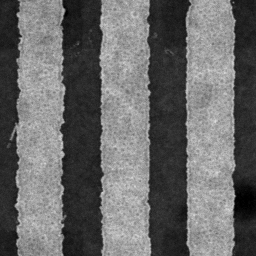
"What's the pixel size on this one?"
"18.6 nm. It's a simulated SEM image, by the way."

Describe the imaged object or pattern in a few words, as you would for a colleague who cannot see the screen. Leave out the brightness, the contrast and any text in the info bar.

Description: one or a few lines or trenches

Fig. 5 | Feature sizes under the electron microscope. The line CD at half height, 45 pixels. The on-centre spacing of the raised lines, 1580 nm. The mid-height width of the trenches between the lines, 733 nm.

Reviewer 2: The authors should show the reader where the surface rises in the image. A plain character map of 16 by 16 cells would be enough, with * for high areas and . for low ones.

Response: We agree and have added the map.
.***..***...**..
.***..***...***.
.***..***...***.
.***..***...***.
.***..***...***.
.***..***...***.
.***..***...***.
.***..***...***.
.***..***...***.
.***..***...***.
.***..***...***.
.***..***...***.
.***..***...***.
.***..***...***.
.***..***...***.
.***..***...**..